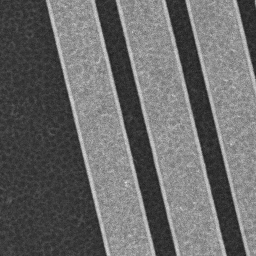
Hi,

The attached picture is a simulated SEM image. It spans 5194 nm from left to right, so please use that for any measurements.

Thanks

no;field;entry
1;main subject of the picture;one or a few lines or trenches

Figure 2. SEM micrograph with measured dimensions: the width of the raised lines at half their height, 44.2 px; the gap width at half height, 478 nm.